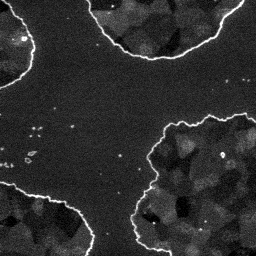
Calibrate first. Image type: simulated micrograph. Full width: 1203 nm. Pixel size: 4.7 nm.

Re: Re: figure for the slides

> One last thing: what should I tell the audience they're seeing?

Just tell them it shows raised bodies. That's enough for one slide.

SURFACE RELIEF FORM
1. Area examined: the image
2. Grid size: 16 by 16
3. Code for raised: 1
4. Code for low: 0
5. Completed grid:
1000001111111110
1100001111111100
1100000111111000
1100000001100000
1100000000000000
0000000000000000
0000000000000000
0000000000000111
0000000000111111
0000000001111111
0000000000111111
1000000001111111
1110000001111111
1111100011111111
1111110011111111
1111110001111111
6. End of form